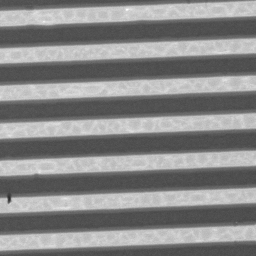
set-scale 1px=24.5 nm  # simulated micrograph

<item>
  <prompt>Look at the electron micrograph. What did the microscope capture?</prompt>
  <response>parallel lines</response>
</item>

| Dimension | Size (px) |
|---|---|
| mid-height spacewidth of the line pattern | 20.1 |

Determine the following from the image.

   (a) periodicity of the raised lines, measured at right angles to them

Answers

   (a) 917 nm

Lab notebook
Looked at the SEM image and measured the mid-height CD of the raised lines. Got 429 nanometers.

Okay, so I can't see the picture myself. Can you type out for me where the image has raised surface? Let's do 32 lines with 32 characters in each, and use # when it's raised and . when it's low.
....................############
################################
######################..........
................................
................................
.............###################
################################
############....................
................................
...........................#####
..##############################
##############################..
#####...........................
................................
....................############
################################
######################..........
................................
................................
............####################
################################
###############.................
................................
..............................##
.....###########################
##############################..
#####...........................
................................
......................##########
################################
######################..........
................................